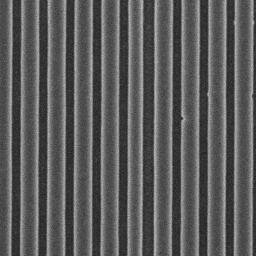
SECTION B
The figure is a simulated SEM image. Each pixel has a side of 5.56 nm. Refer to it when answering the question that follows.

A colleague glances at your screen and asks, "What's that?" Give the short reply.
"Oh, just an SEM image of parallel lines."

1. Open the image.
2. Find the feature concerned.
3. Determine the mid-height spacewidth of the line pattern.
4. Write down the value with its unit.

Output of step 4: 0.05 microns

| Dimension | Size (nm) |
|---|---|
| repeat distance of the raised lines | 149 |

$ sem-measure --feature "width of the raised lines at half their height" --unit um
0.0994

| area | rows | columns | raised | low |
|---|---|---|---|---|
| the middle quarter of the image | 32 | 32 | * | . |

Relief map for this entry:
...****...****..****...****...**
...****...****..****...****...**
...****...****..****...****...**
...****...****..****...****..***
...****...****..****...****..***
...****...****..****...****..***
...****...****..****...****..***
...****...****..****...****..***
...****...****..****...****..***
...****...****..****...****..***
...****...****..****...****..***
...****...****..****...****..***
...****...****..****...****..***
...****...****..****...****...**
...****...****..****...****..***
...****...****..****...****..***
...****...****..****...****..***
...****..*****..****...****..***
...****...****..****...****..***
...****..*****..****...****..***
...****..*****..****...****..***
...****..*****..****...****..***
...****..*****..****...****..***
...****..*****..****...****..***
...****..*****..****...****..***
...****..****...****...****..***
...****..****...****...****..***
...****..****...****...****..***
...****..****...****...****..***
...****..****...****...****..***
...****..****...****...****..***
...****..****...****...****..***